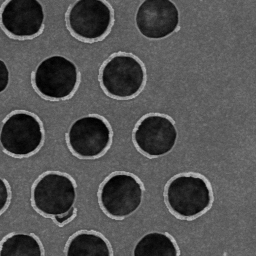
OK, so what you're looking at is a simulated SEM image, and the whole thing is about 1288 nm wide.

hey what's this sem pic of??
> holes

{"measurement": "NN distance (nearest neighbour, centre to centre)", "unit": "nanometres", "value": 335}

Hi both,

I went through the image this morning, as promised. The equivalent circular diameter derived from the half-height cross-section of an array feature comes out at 204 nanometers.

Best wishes